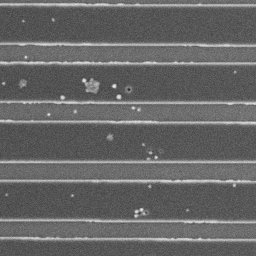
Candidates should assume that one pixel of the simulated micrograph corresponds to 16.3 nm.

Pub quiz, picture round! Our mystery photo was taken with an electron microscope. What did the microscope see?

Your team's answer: lines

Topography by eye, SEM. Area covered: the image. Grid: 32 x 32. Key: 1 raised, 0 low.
00000000000000000000000000000000
11111111111111111111111111111111
11111111111111111111111111111111
11111111111111111111111111111111
11111111111111111111111111111111
00100111111111111111111111111111
00000000000000000000000000000000
00000000000000000000000000000000
11111111111111111111111111111111
11111111111111111111111111111111
11111111111111111111111111111111
11111111111111111111111111111111
11111111111111111111111111111111
00000000000000000000000000000000
00000000000000000000000000000000
11111111111111111111111111111111
11111111111111111111111111111111
11111111111111111111111111111111
11111111111111111111111111111111
11111111111111111111111111111111
00000000000000000000000000000000
00000000000000000000000000000000
00000000000000000000000000000000
11111111111111111111111111111111
11111111111111111111111111111111
11111111111111111111111111111111
11111111111111111111111111111111
11111111111111111111111111111111
00000000000000000000000000000000
00000000000000000000000000000000
11111111111111111111111111111111
11111111111111111111111111111111